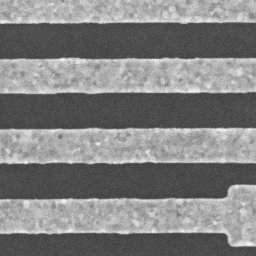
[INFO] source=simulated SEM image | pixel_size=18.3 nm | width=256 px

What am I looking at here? wiring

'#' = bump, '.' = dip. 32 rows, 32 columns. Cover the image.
################################
################################
################################
................................
................................
................................
................................
............................##.#
################################
################################
################################
................................
................................
................................
................................
................................
################################
################################
################################
################################
................................
................................
................................
.............................###
.............................###
################################
################################
################################
################################
.............................###
.............................#..
................................